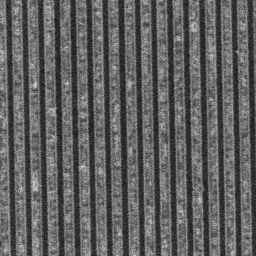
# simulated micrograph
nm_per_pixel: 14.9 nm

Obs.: parallel lines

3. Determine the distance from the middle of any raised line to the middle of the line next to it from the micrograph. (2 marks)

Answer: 240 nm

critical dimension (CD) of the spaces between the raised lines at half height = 93.1 nm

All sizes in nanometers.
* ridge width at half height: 145